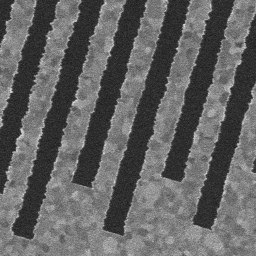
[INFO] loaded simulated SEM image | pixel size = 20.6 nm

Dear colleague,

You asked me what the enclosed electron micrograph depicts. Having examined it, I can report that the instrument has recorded parallel lines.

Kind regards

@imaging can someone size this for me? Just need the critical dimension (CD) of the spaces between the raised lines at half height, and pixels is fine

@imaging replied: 21.9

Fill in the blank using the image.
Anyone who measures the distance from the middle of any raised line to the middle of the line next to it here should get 42.3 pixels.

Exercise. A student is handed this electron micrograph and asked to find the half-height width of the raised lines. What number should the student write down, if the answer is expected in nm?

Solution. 422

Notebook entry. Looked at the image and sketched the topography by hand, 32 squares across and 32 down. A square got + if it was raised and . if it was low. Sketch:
..++...+++...++...+++...++...+++
.+++...+++...++...+++..+++...+++
.+++...++...+++...++...+++...++.
.+++...++...+++..+++...+++..+++.
.++...+++...++...+++...++...+++.
+++...++...+++...++...+++...+++.
+++...++...+++..+++...+++..+++..
++...+++...++...+++...++...+++..
++...++...+++...+++..+++...++...
++...++...+++...++...+++...++...
++..+++...++...+++...+++..+++...
+...+++...++...+++...++...+++...
+...++...+++...++...+++...++...+
+...++...+++..+++...+++..+++...+
...+++...++...+++...++...+++...+
...++...+++...++...+++...+++..++
...++...+++...++...+++..+++...++
..+++...+++..+++...+++..+++...++
..+++..+++...+++..+++...+++...++
..++...+++...++...+++...++...+++
.+++...+++...++...+++..+++...+++
.+++...++...+++...++...+++...+++
.++...+++...++...++++..+++..++++
.++...++++++++...++++++++...++++
+++...++++++++...++++++++...++++
+++..+++++++++..+++++++++...++++
++...++++++++...++++++++...+++++
++...++++++++...++++++++...+++++
+...+++++++++...+++++++++.++++++
++..++++++++++++++++++++++++++++
++++++++++++++++++++++++++++++++
++++++++++++++++++++++++++++++++